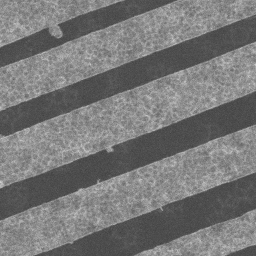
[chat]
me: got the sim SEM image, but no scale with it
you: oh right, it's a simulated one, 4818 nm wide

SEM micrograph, one or a few lines or trenches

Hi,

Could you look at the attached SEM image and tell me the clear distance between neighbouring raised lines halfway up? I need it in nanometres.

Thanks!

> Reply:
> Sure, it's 561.